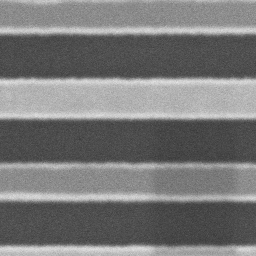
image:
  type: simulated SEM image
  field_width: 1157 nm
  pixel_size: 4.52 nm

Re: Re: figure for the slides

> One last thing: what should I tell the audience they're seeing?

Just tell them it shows lines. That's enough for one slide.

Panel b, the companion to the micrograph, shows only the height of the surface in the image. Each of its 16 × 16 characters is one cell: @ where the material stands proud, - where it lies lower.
@@@@@@@@@@@@@@@@
@@@@@@@@@@@@@@@@
----------------
----------------
----------------
@@@@@@@@@@@@@@@@
@@@@@@@@@@@@@@@@
----------------
----------------
----------------
@@@@@@@@@@@@@@@@
@@@@@@@@@@@@@@@@
----------------
----------------
----------------
@@@@@@@@@@@@@@@@